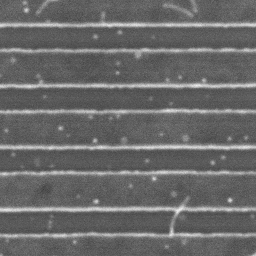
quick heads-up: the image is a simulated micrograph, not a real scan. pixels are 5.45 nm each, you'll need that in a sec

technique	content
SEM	lines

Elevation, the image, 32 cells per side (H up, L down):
HHHHHHHHHHHHHHHHHHHHHHHHHHHHHHHH
HHHHHHHHHHHHHHHHHHHHHHHHHHHHHHHH
HHHHHHHHHHHHHHHHHHHHHHHHHHHHHHHH
LLLLLLLLLLLLLLLLLLLLLLLLLLLLLLLL
LLLLLLLLLLLLLLLLLLLLLLLLLLLLLLLL
LLLLLLLLLLLLLLLLLLLLLLLLLLLLLLLL
HHHHHHHHHHHHHHHHHHHHHHHHHHHHHHHH
HHHHHHHHHHHHHHHHHHHHHHHHHHHHHHHH
HHHHHHHHHHHHHHHHHHHHHHHHHHHHHHHH
HHHHHHHHHHHHHHHHHHHHHHHHHHHHHHHH
HHHHHHHHHHHHHHHHHHHHHHHHHHHHHHHH
LLLLLLLLLLLLLLLLLLLLLLLLLLLLLLLL
LLLLLLLLLLLLLLLLLLLLLLLLLLLLLLLL
LLLLLLLLLLLLLLLLLLLLLLLLLLLLLLLL
HHHHHHHHHHHHHHHHHHHHHHHHHHHHHHHH
HHHHHHHHHHHHHHHHHHHHHHHHHHHHHHHH
HHHHHHHHHHHHHHHHHHHHHHHHHHHHHHHH
HHHHHHHHHHHHHHHHHHHHHHHHHHHHHHHH
LLLLLLLLLLLLLLLLLLLLLLLLLLLLLLLL
LLLLLLLLLLLLLLLLLLLLLLLLLLLLLLLL
LLLLLLLLLLLLLLLLLLLLLLLLLLLLLLLL
LLLLLLHHHHLLLLLHHHLHHHHHHLLHHLLL
HHHHHHHHHHHHHHHHHHHHHHHHHHHHHHHH
HHHHHHHHHHHHHHHHHHHHHHHHHHHHHHHH
HHHHHHHHHHHHHHHHHHHHHHHHHHHHHHHH
HHHHHHHHHHHHHHHHHHHHHHHHHHHHHHHH
LLLLLLLLLLLLLLLLLLLLLLLLLLLLLLLL
LLLLLLLLLLLLLLLLLLLLLLLLLLLLLLLL
LLLLLLLLLLLLLLLLLLLLLLLLLLLLLLLL
HHHHHHHHHHHHHHHHHHHHHHHHHHHHHHHH
HHHHHHHHHHHHHHHHHHHHHHHHHHHHHHHH
HHHHHHHHHHHHHHHHHHHHHHHHHHHHHHHH